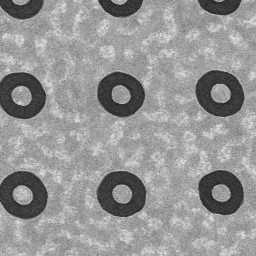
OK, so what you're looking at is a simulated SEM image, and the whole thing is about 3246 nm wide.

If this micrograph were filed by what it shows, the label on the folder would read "ring-shaped grooves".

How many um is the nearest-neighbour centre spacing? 1.25